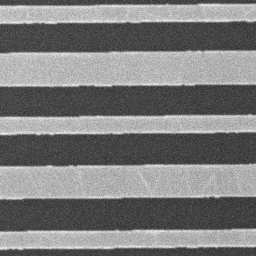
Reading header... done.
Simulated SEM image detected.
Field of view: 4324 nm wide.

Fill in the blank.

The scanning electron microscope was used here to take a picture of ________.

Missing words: lines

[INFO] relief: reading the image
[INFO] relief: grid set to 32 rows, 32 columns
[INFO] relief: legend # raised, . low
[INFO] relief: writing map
................................
################################
################################
................................
................................
................................
.......................#.#######
################################
################################
################################
#########################.......
................................
................................
................................
..........................######
################################
########################........
................................
................................
................................
................................
################################
################################
################################
################################
................................
................................
................................
................................
################################
################################
................................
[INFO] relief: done